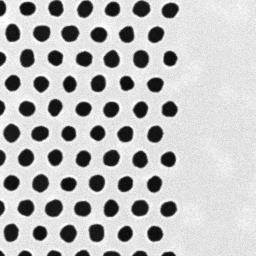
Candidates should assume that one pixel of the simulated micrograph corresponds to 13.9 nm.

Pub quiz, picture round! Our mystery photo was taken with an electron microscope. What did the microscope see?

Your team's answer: a regular array of holes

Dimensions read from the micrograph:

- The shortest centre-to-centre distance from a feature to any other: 389 nanometres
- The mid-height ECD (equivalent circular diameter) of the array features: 232 nanometers